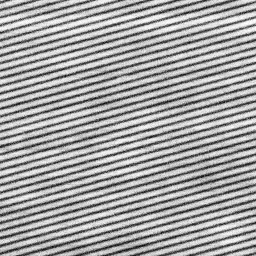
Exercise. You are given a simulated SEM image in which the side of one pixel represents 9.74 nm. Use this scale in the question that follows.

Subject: parallel lines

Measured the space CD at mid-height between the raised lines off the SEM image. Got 34.1 nanometers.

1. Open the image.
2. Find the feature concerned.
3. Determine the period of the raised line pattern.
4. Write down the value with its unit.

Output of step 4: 71.6 nanometers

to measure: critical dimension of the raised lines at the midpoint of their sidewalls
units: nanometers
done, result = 35.3